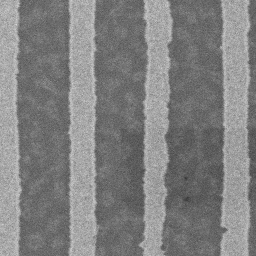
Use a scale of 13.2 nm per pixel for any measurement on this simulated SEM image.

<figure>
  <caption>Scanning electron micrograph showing one or a few lines or trenches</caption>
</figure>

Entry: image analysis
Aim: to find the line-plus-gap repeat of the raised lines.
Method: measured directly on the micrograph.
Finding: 1010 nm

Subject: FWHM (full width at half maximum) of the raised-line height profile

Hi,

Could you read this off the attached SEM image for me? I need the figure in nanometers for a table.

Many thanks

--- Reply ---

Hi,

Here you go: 284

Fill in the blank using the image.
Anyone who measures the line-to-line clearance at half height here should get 725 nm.